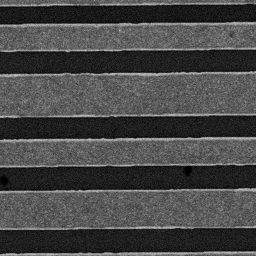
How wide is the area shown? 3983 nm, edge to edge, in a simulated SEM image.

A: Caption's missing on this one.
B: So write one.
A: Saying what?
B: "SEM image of lines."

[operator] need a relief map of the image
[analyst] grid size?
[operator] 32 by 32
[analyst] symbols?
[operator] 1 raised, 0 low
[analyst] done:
11111111111111110000000000000000
00000000000000000000000000000000
00000000000000000000000000000000
11111111111111111111111111111111
11111111111111111111111111111111
11111111111111111111111111111111
00000000000000000000000000000000
00000000000000000000000000000000
00000000000000000000000000000000
11111111111111111111111111111111
11111111111111111111111111111111
11111111111111111111111111111111
11111111111111111111111111111111
11111111111111111111111111111111
11111111100000000000000000000000
00000000000000000000000000000000
00000000000000000000000000000000
00001111111111111111111111111111
11111111111111111111111111111111
11111111111111111111111111111111
11111111111111111111111111111111
00000000000000000000000000000000
00000000000000000000000000000000
00000000000000000000000000000000
11111111111111111111111111111111
11111111111111111111111111111111
11111111111111111111111111111111
11111111111111111111111111111111
11111111111111111000000000000000
00000000000000000000000000000000
00000000000000000000000000000000
00000000000000000000000000000000